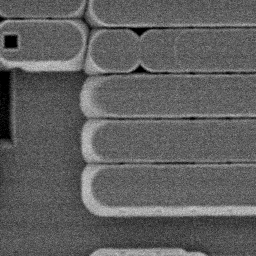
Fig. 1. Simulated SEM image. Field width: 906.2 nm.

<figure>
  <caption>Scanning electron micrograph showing wiring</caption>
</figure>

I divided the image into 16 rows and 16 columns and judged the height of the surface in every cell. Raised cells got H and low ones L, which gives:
HHHHHHHHHHHHHHHH
HHHHHHHHHHHHHHHH
HHHHHHHHHHHHHHHH
HHHHHHHHHHHHHHHH
LLLLLLHHHHHHHHHH
LLLLLHHHHHHHHHHH
LLLLLHHHHHHHHHHH
LLLLLLHHHHHHHHHH
LLLLLHHHHHHHHHHH
LLLLLLHHHHHHHHHH
LLLLLLHHHHHHHHHH
LLLLLHHHHHHHHHHH
LLLLLLHHHHHHHHHH
LLLLLLLLLLLLLLLL
LLLLLLLLLLLLLLLL
LLLLLLLLLLLLLLLL